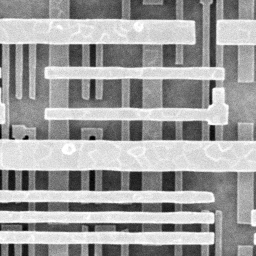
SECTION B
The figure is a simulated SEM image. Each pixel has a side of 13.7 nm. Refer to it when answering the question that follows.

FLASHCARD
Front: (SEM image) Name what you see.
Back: wiring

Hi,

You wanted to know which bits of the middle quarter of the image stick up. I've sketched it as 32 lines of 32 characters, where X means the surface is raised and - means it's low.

--------------------------------
XXXXXXXXXXXXXXXXXXXXXXXXXXXXXXXX
XXXXXXXXXXXXXXXXXXXXXXXXXXXXXXXX
XXXXXXXXXXXXXXX--XXXXXXXXXXXXXXX
--------------------------------
--------------------------------
--------------------------------
--------------------------------
--------------------------------
--------------------------------
--------------------------------
XXXXXXXXXXXXXXXXXXXXXXXXXXXXXXXX
XXXXXXXXXXXXXXXXXXXXXXXXXXXXXXXX
XXXXXXXXXXXXXXXXXXXXXXXXXXXXXXXX
--------------------------------
--------------------------------
--------------------------------
--------------------------------
--------------------------------
XXXXXXXXXXXXXXXXXXXXXXXXXXXXXXXX
XXXXXXXXXXXXXXXXXXXXXXXXXXXXXXXX
XXXXXXXXXXXXXXXXXXXXXXXXXXXXXXXX
XXXXXXXXXXXXXXXXXXXXXXXXXXXXXXXX
XXXXXXXXXXXXXXXXXXXXXXXXXXXXXXXX
XXXXXXXXXXXXXXXXXXXXXXXXXXXXXXXX
XXXXXXXXXXXXXXXXXXXXXXXXXXXXXXXX
XXXXXX-----XXXXXXXXXXXXXXXXXXXXX
--------------------------------
--------------------------------
--------------------------------
--------------------------------
--------------------------------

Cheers